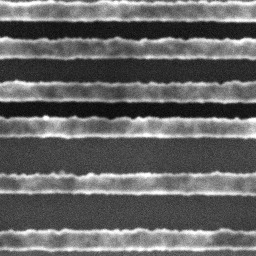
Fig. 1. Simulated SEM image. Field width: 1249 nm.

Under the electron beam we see lines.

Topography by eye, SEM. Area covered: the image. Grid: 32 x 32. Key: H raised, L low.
HHHHHHHHHHHHHHHHHHHHHHHHHHHHHHHH
HHHHHHHHHHHHHHHHHHHHHHHHHHHHHHHH
HHHHHHHHHHHHHHHHHHHHHHHHHHHHHHHH
LLLLLLLLLLLLLLLLLLLLLLLLLLLLLLLL
LLLLLLLLLLLLLLLLLLLLLLLLLLLLLLLL
HHHHHHHHHHHHHHHHHHHHHHHHHHHHHHHH
HHHHHHHHHHHHHHHHHHHHHHHHHHHHHHHH
LLLLLLLLLLLLLLLLLLLLLLLLLLLLLLLL
LLLLLLLLLLLLLLLLLLLLLLLLLLLLLLLL
LLLLLLLLLLLLLLLLLLLLLLLLLLLLLLLL
HHHHHHHHHHHHHHHLHHHHLHHHHHHLHHHH
HHHHHHHHHHHHHHHHHHHHHHHHHHHHHHHH
HHHHHHHHHHHHHHHHHHHHHHHHHHHHHHHH
LLLLLLLLLLLLLLLLLLLLLLLLLLLLLLLL
LLLLLLLLLLLLLLLLLLLLLLLLLLLLLLLL
HHHHHHHHHHHHHHHHHHHHHHHHHHHHHHHH
HHHHHHHHHHHHHHHHHHHHHHHHHHHHHHHH
LLLLLLLLLLLLLLLLLLLLLLLLLLLLLLLL
LLLLLLLLLLLLLLLLLLLLLLLLLLLLLLLL
LLLLLLLLLLLLLLLLLLLLLLLLLLLLLLLL
LLLLLLLLLLLLLLLLLLLLLLLLLLLLLLLL
LLLLLLLLLLLLLLLLLLLLLLLLLLLLLLLL
HHHHHHHHHHHHHHHHHHHHHHHHHHHHHHHH
HHHHHHHHHHHHHHHHHHHHHHHHHHHHHHHH
LLLLLLLLLLLLLLLLLLLLLLLLLLLLLLLL
LLLLLLLLLLLLLLLLLLLLLLLLLLLLLLLL
LLLLLLLLLLLLLLLLLLLLLLLLLLLLLLLL
LLLLLLLLLLLLLLLLLLLLLLLLLLLLLLLL
LLLLLLLLLLLLLLLLLLLLLLLLLLLLLLLL
HHHHHHHHHHHHHHHHHHHHHHHHHHHHHHHH
HHHHHHHHHHHHHHHHHHHHHHHHHHHHHHHH
LLLLLLLLLLLLLLLLLLLLLLLLLLLLLLLL